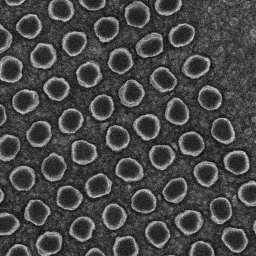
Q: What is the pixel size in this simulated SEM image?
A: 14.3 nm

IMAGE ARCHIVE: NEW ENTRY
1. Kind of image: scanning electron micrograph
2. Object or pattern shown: a regular array of raised bodies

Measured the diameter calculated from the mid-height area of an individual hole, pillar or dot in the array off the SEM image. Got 0.337 microns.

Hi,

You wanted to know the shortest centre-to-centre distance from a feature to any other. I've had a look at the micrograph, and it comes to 0.477 µm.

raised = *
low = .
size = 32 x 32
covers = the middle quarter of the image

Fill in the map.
....****...******.............**
...******...****.......***....**
...******.............*****....*
...******.............******....
....****........**....******....
*....**........****....*****....
*..............*****....**......
*.............******............
........****..******.......*....
.......*****...****.......****..
.......*****..............****..
.**....*****..............*****.
****...*****..............*****.
*****...***........****...*****.
****..............*****....***..
****........**....******........
***........*****..******........
...........*****...****.......**
...........*****....***......***
...***.....*****.............***
..*****.....***........*.*...***
..******..............*****..***
..******..............*****.....
..******..............*****.....
...***........****....*****.....
*............******....***......
.............******.............
.............******.............
.......****....****.............
......*****...............****..
......******..............****..
***...******.......**....******.